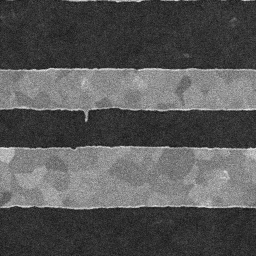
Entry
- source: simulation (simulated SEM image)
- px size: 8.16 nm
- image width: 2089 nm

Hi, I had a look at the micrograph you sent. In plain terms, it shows one or a few lines or trenches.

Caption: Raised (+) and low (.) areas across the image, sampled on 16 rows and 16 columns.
................
................
................
................
++++++++++++++++
++++++++++++++++
++++++++++++++++
................
................
++++++++++++++++
++++++++++++++++
++++++++++++++++
++++++++++++++++
................
................
................